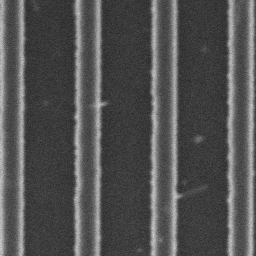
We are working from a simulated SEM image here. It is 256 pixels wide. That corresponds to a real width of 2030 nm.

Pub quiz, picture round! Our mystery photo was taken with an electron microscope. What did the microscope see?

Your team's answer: lines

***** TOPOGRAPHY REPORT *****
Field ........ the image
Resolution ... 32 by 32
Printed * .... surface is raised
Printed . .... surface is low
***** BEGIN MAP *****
***.......**.......***.......***
***.......**.......***.......***
***.......**.......***.......***
***.......**.......***.......***
***.......**.......***.......***
***.......**.......***.......***
***.......**.......***.......***
***.......**.......***.......***
***.......**.......***.......***
***.......**.......***.......***
***.......**.......***.......***
***.......**.......***.......***
***.......**.......***.......***
***.......**.......***.......***
***.......**.......***.......***
***.......**.......***.......***
***.......**.......***.......***
***......***.......***.......***
***.......**.......***.......***
***.......**.......***.......***
***......***.......***.......***
***.......**.......***.......***
***.......**.......***.......***
***.......**.......***.......***
***.......**.......***.......***
***......***.......***.......***
***.......**.......***.......***
***.......**.......***.......***
***.......**.......***.......***
***.......**.......***.......***
***.......**.......***.......***
***.......**.......***.......***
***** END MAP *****